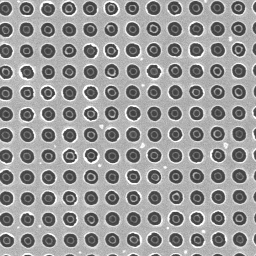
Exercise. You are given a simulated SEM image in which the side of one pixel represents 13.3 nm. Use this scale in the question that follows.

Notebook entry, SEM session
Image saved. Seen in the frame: a regular array of ring-shaped grooves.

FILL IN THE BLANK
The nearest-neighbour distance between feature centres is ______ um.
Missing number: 0.275